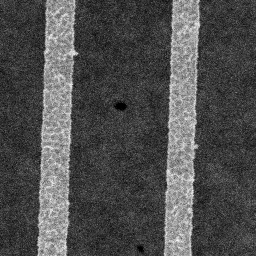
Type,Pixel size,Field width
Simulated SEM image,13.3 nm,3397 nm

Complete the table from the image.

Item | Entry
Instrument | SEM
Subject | one or a few lines or trenches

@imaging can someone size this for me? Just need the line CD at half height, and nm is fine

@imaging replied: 335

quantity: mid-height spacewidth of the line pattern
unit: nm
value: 1310